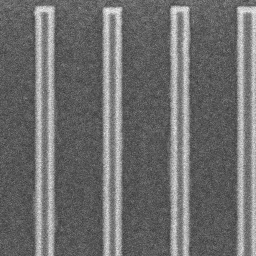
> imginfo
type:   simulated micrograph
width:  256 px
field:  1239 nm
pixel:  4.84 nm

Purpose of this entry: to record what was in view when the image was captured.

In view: one or a few lines or trenches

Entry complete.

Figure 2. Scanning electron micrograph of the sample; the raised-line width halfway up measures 72.7 nanometers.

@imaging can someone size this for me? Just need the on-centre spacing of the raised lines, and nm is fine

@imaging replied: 328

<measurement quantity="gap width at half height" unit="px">52.8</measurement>